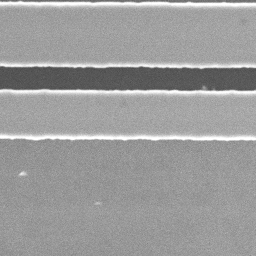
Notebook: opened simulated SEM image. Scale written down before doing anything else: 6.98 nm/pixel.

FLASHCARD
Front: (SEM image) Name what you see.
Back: lines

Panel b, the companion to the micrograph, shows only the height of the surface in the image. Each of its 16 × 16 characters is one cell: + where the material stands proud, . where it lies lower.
++++++++++++++++
++++++++++++++++
++++++++++++++++
++++++++++++++++
................
................
++++++++++++++++
++++++++++++++++
++++++++++++++++
................
................
................
................
................
................
................